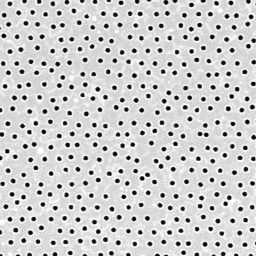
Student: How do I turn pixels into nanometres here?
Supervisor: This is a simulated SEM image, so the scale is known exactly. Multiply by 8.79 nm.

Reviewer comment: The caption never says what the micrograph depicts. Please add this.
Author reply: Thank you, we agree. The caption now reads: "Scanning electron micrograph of a regular array of holes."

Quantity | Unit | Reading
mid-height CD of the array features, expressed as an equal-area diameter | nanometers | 43.2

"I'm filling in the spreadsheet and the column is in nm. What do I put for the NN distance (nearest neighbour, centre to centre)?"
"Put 98.7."